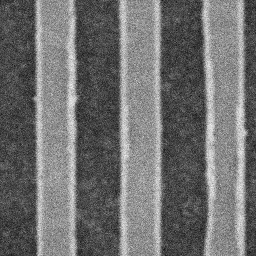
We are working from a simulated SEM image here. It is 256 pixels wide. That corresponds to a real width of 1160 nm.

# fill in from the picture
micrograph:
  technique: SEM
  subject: one or a few lines or trenches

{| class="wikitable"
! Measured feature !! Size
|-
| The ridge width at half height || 160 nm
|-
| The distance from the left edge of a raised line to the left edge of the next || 0.383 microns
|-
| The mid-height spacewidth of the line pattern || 225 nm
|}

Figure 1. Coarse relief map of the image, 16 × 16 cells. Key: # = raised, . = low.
..###...##...##.
..###...##...##.
..###...##...##.
..###...##...##.
..###...##...##.
..###...##...##.
..###...##...##.
..###...##...##.
..###...##...##.
..###...##...##.
..###...##...##.
...#....##...##.
..###...##...##.
..###...##...##.
..###...##...##.
..###...##...##.